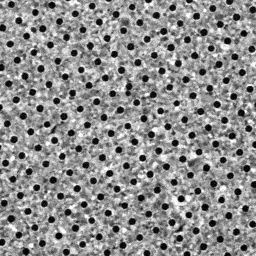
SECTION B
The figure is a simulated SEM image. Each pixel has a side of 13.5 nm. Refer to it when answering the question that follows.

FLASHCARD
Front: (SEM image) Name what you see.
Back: a regular array of holes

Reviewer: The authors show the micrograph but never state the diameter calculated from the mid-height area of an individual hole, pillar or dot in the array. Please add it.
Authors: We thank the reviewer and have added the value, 106 nanometres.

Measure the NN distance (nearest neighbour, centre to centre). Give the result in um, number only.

0.237